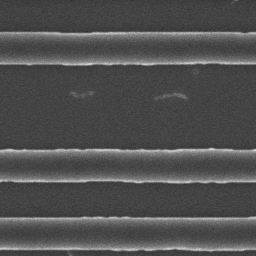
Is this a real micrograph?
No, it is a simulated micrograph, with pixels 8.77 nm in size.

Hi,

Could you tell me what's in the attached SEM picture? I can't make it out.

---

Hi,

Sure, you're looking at lines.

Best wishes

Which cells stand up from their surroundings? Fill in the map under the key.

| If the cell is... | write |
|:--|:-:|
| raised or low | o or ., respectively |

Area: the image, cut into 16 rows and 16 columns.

................
................
oooooooooooooooo
oooooooooooooooo
................
................
................
................
................
oooooooooooooooo
oooooooooooooooo
................
................
................
oooooooooooooooo
oooooooooooooooo